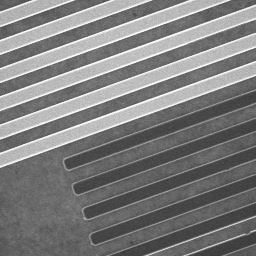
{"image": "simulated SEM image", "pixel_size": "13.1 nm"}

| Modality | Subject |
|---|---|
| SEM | parallel lines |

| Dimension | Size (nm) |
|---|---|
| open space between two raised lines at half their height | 184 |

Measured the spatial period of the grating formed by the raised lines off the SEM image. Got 346 nm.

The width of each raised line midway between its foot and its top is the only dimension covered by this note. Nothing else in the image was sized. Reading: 163 nm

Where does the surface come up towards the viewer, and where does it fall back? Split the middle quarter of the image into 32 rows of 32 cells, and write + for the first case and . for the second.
......+++++++++..........+++++++
...+++++++++...........+++++++++
+++++++++...........+++++++++...
+++++++..........+++++++++......
++++..........+++++++++.........
+...........+++++++++..........+
.........+++++++++..........++++
......+++++++++...........++++++
...+++++++++...........+++++++++
++++++++++..........+++++++++...
+++++++..........+++++++++......
++++..........++++++++++........
+...........+++++++++..........+
.........+++++++++...........+++
......+++++++++...........++++++
...+++++++++...........+++++++++
.+++++++++..........+++++++++...
+++++++..........++++++++++.....
++++...........+++++++++........
+...........+++++++++...........
.........+++++++++...........+++
......+++++++++...........++++++
....+++++++++..........+++++++++
.+++++++++..........+++++++++...
+++++++...........+++++++++.....
++++...........+++++++++........
............+++++++++...........
.........+++++++++...........+++
......++++++++++..........++++++
....+++++++++..........+++++++++
..++++++++...........+++++++++..
..+++++...........+++++++++.....